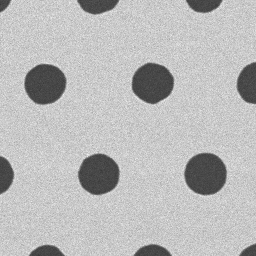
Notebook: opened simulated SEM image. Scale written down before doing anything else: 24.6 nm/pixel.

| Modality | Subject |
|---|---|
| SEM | holes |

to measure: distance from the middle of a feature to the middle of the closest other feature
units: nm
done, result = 2590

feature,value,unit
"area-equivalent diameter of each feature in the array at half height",1020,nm